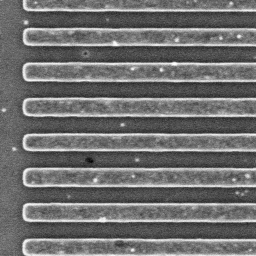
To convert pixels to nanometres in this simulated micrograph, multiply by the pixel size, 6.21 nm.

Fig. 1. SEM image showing wiring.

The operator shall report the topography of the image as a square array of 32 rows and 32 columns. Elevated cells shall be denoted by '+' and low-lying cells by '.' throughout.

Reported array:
...+++++++++++++++++++++++++++++
................................
................................
................................
...+++++++++++++++++++++++++++++
...+++++++++++++++++++++++++++++
................................
................................
...+++++++++++++++++++++++++++++
...+++++++++++++++++++++++++++++
................................
................................
...+++++++++++++++++++++++++++++
...+++++++++++++++++++++++++++++
....++++++++++++++++++++++++++++
................................
................................
...+++++++++++++++++++++++++++++
...+++++++++++++++++++++++++++++
................................
................................
...+++++++++++++++++++++++++++++
...+++++++++++++++++++++++++++++
................................
................................
......++........................
...+++++++++++++++++++++++++++++
...+++++++++++++++++++++++++++++
................................
................................
...+++++++++++++++++++++++++++++
...+++++++++++++++++++++++++++++